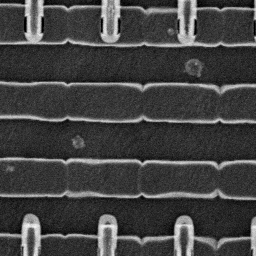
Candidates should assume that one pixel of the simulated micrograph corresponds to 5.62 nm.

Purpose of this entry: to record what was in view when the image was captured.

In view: wiring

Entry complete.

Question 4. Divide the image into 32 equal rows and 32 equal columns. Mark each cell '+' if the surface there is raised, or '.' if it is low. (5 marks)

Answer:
...++........++.......++........
++++++++++++++++++++++++++++++++
++++++++++++++++++++++++++++++++
++++++++++++++++++++++++++++++++
++++++++++++++++++++++++++++++++
...........+++++++++++++++++++++
................................
................................
................................
................................
+++.++++++++++++....+++.........
++++++++++++++++++++++++++++++++
++++++++++++++++++++++++++++++++
++++++++++++++++++++++++++++++++
++++++++++++++++++++++++++++++++
................................
................................
................................
................................
................................
+++++++++++++++++++++++++++.++++
++++++++++++++++++++++++++++++++
++++++++++++++++++++++++++++++++
++++++++++++++++++++++++++++++++
.+++..++.....++++.+++....+..++++
................................
................................
...+.........+..................
...++.......++........++........
+++++++++++.+++......+++.......+
++++++++++++++++++++++++++++++++
++++++++++++++++++++++++++++++++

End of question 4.